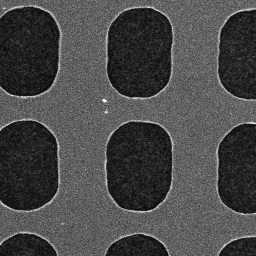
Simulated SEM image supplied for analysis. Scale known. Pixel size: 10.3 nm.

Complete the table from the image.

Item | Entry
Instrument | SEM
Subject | holes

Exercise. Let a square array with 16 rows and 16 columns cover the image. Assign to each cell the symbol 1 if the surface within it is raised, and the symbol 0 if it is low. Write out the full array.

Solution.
1011111101111111
0000111000011100
0000111000011100
0000111000011100
0000111000011100
0001111000111100
1111111111111111
1111111111111111
0001111000011100
0000111000011100
0000111000011100
0000111000011100
0001111000111100
1111111111111111
1111111111111111
0001111000111100